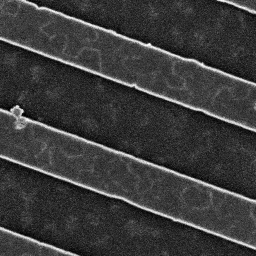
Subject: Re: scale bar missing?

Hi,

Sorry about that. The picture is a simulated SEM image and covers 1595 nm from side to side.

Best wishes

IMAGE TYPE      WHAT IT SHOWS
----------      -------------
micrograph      one or a few lines or trenches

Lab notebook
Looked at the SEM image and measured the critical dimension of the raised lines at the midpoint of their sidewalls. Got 271 nm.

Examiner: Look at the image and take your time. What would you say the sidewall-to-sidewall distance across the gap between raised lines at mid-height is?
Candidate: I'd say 0.419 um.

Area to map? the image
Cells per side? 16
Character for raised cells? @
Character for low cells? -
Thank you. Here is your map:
@@@------------@
@@@@@@----------
@@@@@@@@--------
---@@@@@@@@-----
------@@@@@@@@--
---------@@@@@@@
-----------@@@@@
@@------------@@
@@@@@-----------
@@@@@@@---------
--@@@@@@@@------
-----@@@@@@@@---
--------@@@@@@@@
----------@@@@@@
@------------@@@
@@@-------------